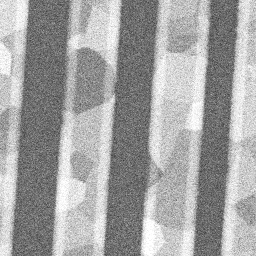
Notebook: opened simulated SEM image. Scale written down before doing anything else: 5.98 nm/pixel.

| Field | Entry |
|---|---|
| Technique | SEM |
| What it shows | one or a few lines or trenches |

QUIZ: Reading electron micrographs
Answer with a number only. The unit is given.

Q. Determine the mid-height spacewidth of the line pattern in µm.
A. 0.303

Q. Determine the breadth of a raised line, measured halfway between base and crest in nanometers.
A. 231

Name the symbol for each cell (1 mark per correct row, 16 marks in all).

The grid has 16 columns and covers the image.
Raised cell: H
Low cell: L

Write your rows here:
HLLLLHHLLLHHHLLH
HLLLLHHLLLHHHLLH
HLLLLHHLLLHHHLLH
HLLLLHHLLLHHHLLH
HLLLHHHLLLHHHLLH
HLLLHHHLLLHHLLLH
HLLLHHHLLLHHLLLH
HLLLHHHLLLHHLLLH
HLLLHHHLLLHHLLLH
HLLLHHHLLLHHLLLH
HLLLHHLLLLHHLLLH
HLLLHHLLLLHHLLLH
HLLLHHLLLHHHLLLH
LLLLHHLLLHHHLLHH
LLLLHHLLLHHHLLHH
LLLLHHLLLHHHLLHH